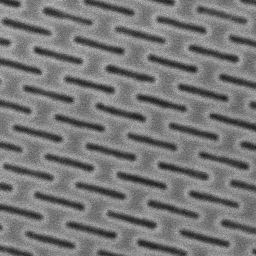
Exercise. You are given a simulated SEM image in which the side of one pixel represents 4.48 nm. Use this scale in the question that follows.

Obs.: a regular array of holes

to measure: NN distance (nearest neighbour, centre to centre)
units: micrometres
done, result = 0.179